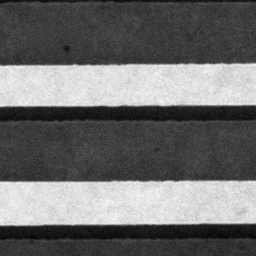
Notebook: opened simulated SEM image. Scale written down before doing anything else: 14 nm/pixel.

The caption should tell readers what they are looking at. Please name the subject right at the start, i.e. lines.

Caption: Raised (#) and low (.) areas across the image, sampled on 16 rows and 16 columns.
................
................
................
................
################
################
################
................
................
................
................
################
################
################
................
................